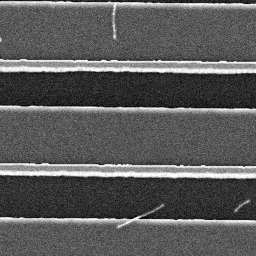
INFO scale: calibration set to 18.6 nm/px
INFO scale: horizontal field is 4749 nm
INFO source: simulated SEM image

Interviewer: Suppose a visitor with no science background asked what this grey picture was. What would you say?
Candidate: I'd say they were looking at lines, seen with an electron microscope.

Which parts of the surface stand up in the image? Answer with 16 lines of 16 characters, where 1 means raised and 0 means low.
1111111111111111
1111111111111111
1111111111111111
1111111111111111
0000000000000000
0000000000000000
0000000000000000
1111111111111111
1111111111111111
1111111111111111
1111111111111111
0000000000000000
0000000000000000
0000000000000000
1111111111111111
1111111111111111